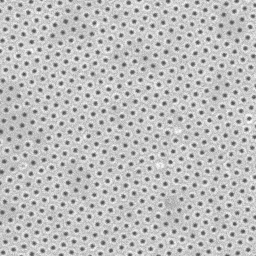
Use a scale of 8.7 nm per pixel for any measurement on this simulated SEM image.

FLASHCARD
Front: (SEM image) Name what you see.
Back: a regular array of holes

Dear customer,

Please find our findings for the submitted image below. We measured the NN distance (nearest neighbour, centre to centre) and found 0.0937 micrometres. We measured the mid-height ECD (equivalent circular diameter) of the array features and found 45 nanometres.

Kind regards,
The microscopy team